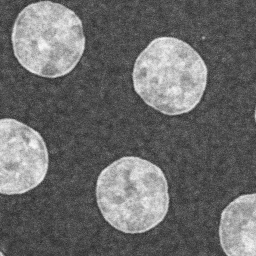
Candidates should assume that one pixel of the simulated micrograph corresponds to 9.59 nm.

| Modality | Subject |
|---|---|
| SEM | raised bodies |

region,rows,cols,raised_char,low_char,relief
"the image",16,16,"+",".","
..++............
.++++...........
.++++.....+.....
.++++....+++....
..++....+++++...
........+++++...
.........+++....
+...............
++..............
+++.............
+++....+++......
++....++++......
......++++.....+
.......+++....++
........+.....++
..............++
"